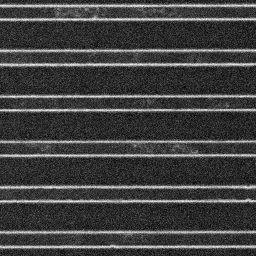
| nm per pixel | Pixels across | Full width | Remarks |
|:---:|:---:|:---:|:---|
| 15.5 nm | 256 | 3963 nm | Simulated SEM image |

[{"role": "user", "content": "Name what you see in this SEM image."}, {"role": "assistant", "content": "parallel lines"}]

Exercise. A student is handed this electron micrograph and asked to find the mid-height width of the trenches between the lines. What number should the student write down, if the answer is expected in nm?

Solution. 484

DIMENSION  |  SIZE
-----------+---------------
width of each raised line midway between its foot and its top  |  0.226 micrometres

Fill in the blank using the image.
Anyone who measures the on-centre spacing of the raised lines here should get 0.704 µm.